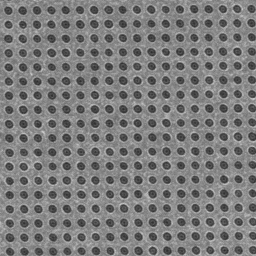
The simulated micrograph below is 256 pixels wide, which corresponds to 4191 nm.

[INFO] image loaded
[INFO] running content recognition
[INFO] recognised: a regular array of ring-shaped grooves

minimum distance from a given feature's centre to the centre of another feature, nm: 229